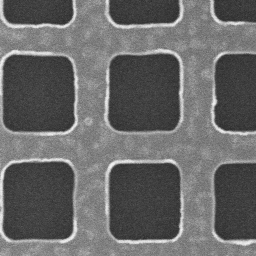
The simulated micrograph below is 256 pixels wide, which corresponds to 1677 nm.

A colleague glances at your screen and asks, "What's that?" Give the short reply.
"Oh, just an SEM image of holes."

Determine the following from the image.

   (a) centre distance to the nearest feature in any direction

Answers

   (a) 694 nanometers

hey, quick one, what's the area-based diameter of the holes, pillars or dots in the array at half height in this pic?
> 82.6 px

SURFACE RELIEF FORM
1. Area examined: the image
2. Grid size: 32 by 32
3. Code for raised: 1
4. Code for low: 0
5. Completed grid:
00000000011111000000001111100000
00000000011111000000000111100000
10000000011111000000001111100000
11111111111111111111111111111111
11111111111111111111111111111111
11111111111111111111111111111111
11111111111111111111111111111111
10000000011111000000001111100000
00000000011111000000000111100000
00000000011111000000000111100000
00000000011111000000000111100000
00000000011111000000001111100000
00000000011111000000001111100000
00000000011110000000000111100000
00000000011110000000001111100000
00000000011111000000001111100000
11000000111111110011111111111001
11111111111111111111111111111111
11111111111111111111111111111111
11111111111111111111111111111111
11000000011111100000001111110000
10000000011111000000001111100000
00000000011110000000000111100000
00000000011110000000000111100000
00000000011110000000000111100000
00000000011110000000000111100000
00000000011110000000000111100000
00000000011110000000000111100000
00000000011111000000001111100000
10000000011111000000001111100000
11111111111111111111111111111111
11111111111111111111111111111111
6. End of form